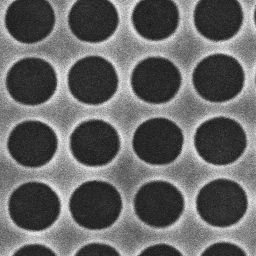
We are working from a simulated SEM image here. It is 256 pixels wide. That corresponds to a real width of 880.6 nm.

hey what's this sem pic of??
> a regular array of holes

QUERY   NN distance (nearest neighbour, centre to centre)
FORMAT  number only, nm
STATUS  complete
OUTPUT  212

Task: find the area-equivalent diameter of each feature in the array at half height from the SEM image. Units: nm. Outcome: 174